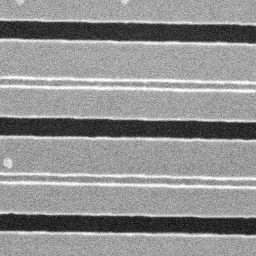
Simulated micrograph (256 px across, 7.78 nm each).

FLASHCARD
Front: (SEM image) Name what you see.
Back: lines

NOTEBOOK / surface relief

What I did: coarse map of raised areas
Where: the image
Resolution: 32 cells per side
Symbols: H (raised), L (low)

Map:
HHHHHHHHHHHHHHHHHHHHHHHHHHHHHHHH
HHHHHHHHHHHHHHHHHHHHHHHHHHHHHHHH
HHHHHHHHHHHHHHHHHHHHHHHHHHHHHHHH
LLLLLLLLLLLLLLLLLLLLLLLLLLLLLLLL
LLLLLLLLLLLLLLLLLLLLLLLLLLLLLLLL
HHHHHHHHHHHHHHHHHHHHHHHHHHHHHLLL
HHHHHHHHHHHHHHHHHHHHHHHHHHHHHHHH
HHHHHHHHHHHHHHHHHHHHHHHHHHHHHHHH
HHHHHHHHHHHHHHHHHHHHHHHHHHHHHHHH
HHHHHHHHHHHHHHHHHHHHHHHHHHHHHHHH
HHHHHHHHHHHHHHHHHHHHHHHHHHHHHHHH
HHHHHHHHHHHHHHHHHHHHHHHHHHHHHHHH
HHHHHHHHHHHHHHHHHHHHHHHHHHHHHHHH
HHHHHHHHHHHHHHHHHHHHHHHHHHHHHHHH
HHHHHHHHHHHHHHHHHHHHHHHHHHHHHHHH
LLLLLLLLLLLLLLLLLLLLLLLLLLLLLLLL
LLLLLLLLLLLLLLLLLLLLLLLLLLLLLLLL
HHHHHHHHHHHHHHHHHHHHHHHHHHHLLLLL
HHHHHHHHHHHHHHHHHHHHHHHHHHHHHHHH
HHHHHHHHHHHHHHHHHHHHHHHHHHHHHHHH
HHHHHHHHHHHHHHHHHHHHHHHHHHHHHHHH
HHHHHHHHHHHHHHHHHHHHHHHHHHHHHHHH
HHHHHHHHHHHHHHHHHHHHHHHHHHHHHHHH
HHHHHHHHHHHHHHHHHHHHHHHHHHHHHHHH
HHHHHHHHHHHHHHHHHHHHHHHHHHHHHHHH
HHHHHHHHHHHHHHHHHHHHHHHHHHHHHHHH
HHHHHHHHHHHHHHHHHHHHHHHHHHHHHHHH
LLLLLLLLLLLLLLLLLLLLLLLLLLLLLLLL
LLLLLLLLLLLLLLLLLLLLLLLLLLLLLLLL
HHHHHHHHHHHHHHHHHHHHHHHHHHHHHHHH
HHHHHHHHHHHHHHHHHHHHHHHHHHHHHHHH
HHHHHHHHHHHHHHHHHHHHHHHHHHHHHHHH